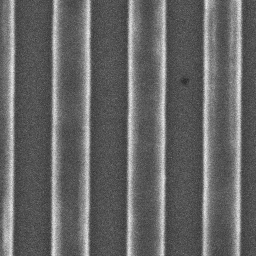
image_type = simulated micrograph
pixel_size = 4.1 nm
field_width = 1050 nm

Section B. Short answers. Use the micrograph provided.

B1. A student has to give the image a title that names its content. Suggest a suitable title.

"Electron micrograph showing wiring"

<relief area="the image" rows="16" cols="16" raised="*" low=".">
*..***..**...**.
*..***..**...**.
*..**...**...**.
*..**...**...**.
*..**...**...**.
*..**...**...**.
*..**...**...**.
*..**...**...**.
*..**...**...**.
*..**...**...**.
*..**...**...**.
*..**...**...**.
*..**...**...**.
*..**...**...**.
*..**...**...**.
*..**...**...**.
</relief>